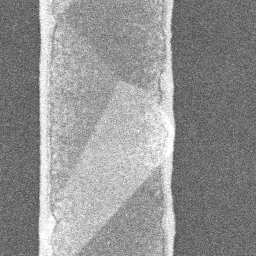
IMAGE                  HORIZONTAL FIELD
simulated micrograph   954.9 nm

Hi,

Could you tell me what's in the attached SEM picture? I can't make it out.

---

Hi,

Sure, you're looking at one or a few lines or trenches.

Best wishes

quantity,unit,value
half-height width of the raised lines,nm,478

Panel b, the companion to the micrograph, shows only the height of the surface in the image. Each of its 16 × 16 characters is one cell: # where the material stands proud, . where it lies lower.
...########.....
...########.....
...########.....
...########.....
...########.....
...########.....
...########.....
...########.....
...########.....
...########.....
...########.....
...########.....
...########.....
...########.....
...########.....
...########.....